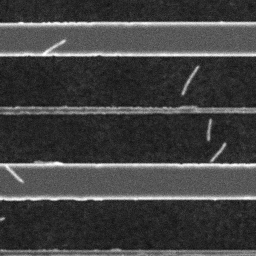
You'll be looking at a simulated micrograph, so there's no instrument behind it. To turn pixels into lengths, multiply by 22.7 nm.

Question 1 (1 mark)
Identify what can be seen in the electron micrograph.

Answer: lines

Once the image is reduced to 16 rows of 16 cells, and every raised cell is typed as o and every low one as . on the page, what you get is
................
oooooooooooooooo
oooooooooooooooo
................
................
................
................
................
................
................
oooooooooooooooo
oooooooooooooooo
................
................
................
................